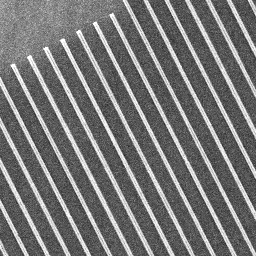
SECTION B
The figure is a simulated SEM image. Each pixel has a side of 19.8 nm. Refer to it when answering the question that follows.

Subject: parallel lines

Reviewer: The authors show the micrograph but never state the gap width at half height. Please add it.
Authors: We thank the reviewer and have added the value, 304 nm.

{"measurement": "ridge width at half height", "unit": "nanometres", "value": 50.6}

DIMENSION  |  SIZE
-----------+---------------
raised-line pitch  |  366 nm